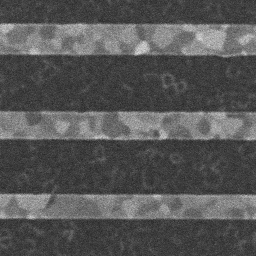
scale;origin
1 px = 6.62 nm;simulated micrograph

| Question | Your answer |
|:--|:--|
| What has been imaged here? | one or a few lines or trenches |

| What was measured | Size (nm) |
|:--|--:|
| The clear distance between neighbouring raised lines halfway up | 383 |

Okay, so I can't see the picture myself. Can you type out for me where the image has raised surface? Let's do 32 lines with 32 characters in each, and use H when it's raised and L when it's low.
LLLLLLLLLLLLLLLLLLLLLLLLLLLLLLLL
LLLLLLLHLLLLLLLLLLLLLLLLLLLLLLLL
LLLLLLLLLLLLLLLLLLLLLLLLLLLLLLLL
HHHHHHHHHHHHHHHHHHHHHHHHHHHHHHHH
HHHHHHHHHHHHHHHHHHHHHHHHHHHHHHHH
HHHHHHHHHHHHHHHHHHHHHHHHHHHHHHHH
HHHHHHHHHHHHHHHHHHHHHHHHHHHHHHHH
LLLLLLLLLLLLLLLLLLLLLLLLLLLLLLLL
LLLLLLLLLLLLLLLLLLLLLLLLLLLLLLLL
LLLLLLLLLLLLLLLLLLLLLLLLLLLLLLLL
LLLLLLLLLLLLLLLLLLLLLLLLLLLLLLLL
LLLLLLLLLLLLLLLLLLLLLLLLLLLLLLLL
LLLLLLLLLLLLLLLLLLLLLLLLLLLLLLLL
LLLLLLLLLLLLLLLLLLLLLLLLLLLLLLLL
HHHHHHHHHHHHHHHHHHHHHHHHHHHHHHHH
HHHHHHHHHHHHHHHHHHHHHHHHHHHHHHHH
HHHHHHHHHHHHHHHHHHHHHHHHHHHHHHHH
LLLLLLLLLLLLLLLLLLLLLLLLLLLLLLLL
LLLLLLLLLLLLLLLLLLLLLLLLLLLLLLLL
LLLLLLLLLLLLLLLLLLLLLLLLLLLLLLLL
LLLLLLLLLLLLLLLLLLLLLLLLLLLLLLLL
LLLLLLLLLLLLLLLLLLLLLLLLLLLLLLLL
LLLLLLLLLLLLLLLLLLLLLLLLLLLLLLLL
HLLLLLLLLLLLLLLLLLLLLLLLLLLLLLLL
HHHHHHHHHHHHHHHHHHHHHLLHHLLLHHHL
HHHHHHHHHHHHHHHHHHHHHHHHHHHHHHHH
HHHHHHHHHHHHHHHHHHHHHHHHHHHHHHHH
LLLLLLLLLLLLLLLLLLLLLLLLLLLLLLLL
LLLLLLLLLLLLLLLLLLLLLLHHLLLLLLLL
LLLLLLLLLLLLLLLLLLLLLLHLLLLLLLLL
LLLLLLLLLLLLLLLLLLLLLLLLLLLLLLLL
LLLLLLLLLLLLLLLLLLLLLLLLLLLLLLLL